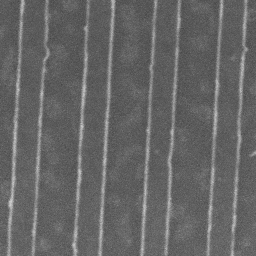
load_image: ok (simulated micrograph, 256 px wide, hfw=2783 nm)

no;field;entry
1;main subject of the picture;one or a few lines or trenches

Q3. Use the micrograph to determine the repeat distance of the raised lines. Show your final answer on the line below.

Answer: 0.72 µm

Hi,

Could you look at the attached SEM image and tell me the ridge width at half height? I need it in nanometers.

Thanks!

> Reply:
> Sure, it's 273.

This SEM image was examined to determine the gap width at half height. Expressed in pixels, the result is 41.3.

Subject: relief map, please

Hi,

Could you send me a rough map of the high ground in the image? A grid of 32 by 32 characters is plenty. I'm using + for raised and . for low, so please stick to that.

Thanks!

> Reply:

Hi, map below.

...+++.....+++.....+++......+++.
...+++.....+++.....+++......+++.
...+++.....+++.....+++......+++.
...+++.....+++.....+++.....++++.
...+++.....+++.....+++.....+++..
..++++.....+++.....+++.....++++.
..++++.....+++.....+++.....++++.
..++++.....+++.....+++.....+++..
..++++.....+++.....+++.....+++..
..+++......+++.....+++.....+++..
..+++......+++.....+++.....+++..
..+++.....++++.....+++.....+++..
..+++.....++++.....+++.....+++..
..+++.....++++.....+++.....+++..
..+++.....++++.....+++.....+++..
..+++.....+++......+++.....+++..
..+++.....+++.....++++.....+++..
..+++.....+++.....++++.....+++..
..+++.....+++.....++++.....+++..
..+++.....+++.....+++......+++..
..+++.....+++.....+++......+++..
..+++.....+++.....+++......+++..
..+++.....+++.....+++.....++++..
..+++.....+++.....+++.....++++..
.++++.....+++.....+++.....+++...
.++++.....+++.....+++.....+++...
.++++.....+++.....+++.....+++...
.++++....++++.....+++.....+++...
.+++.....++++.....+++.....+++...
.+++.....++++.....+++.....+++...
.+++.....++++.....+++.....+++...
.+++.....++++.....+++.....+++...